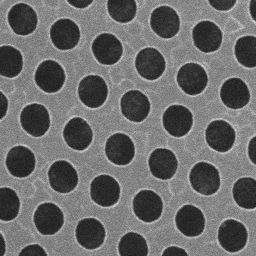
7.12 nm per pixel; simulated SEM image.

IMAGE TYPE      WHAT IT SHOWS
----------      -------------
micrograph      a regular array of holes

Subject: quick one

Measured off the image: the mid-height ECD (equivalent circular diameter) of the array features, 31.7 px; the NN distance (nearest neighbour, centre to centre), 318 nanometers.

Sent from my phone